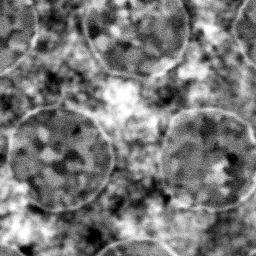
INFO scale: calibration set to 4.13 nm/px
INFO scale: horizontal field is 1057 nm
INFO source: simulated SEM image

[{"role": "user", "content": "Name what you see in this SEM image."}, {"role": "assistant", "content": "raised bodies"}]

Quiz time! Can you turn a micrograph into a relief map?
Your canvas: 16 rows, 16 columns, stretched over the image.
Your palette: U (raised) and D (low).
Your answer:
UUDDDDDDDDUDDDDU
UUDDDUDDDDUUDDDU
UUDDDDUUDUUUDDDU
UUDDDDUUUUUDDDDU
DDDDDDDUUUDDDDDD
DDDDDDDDDDDDDDDD
DDDDDDDDDDDDDDDD
DUUUUUDDDDDUUUUD
DUUUUUUDDDUUUUUU
DUUUUUUDDDUUUUUU
DUUUUUUDDDUUUUUU
DUUUUUUDDDUUUUUU
DDUUUUDDDDDUUUUD
DDDDDDDDDDDDDDDD
DDDDDDDDDDDDDDDD
UDDDDDDUUUUDDDDD